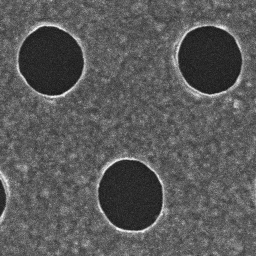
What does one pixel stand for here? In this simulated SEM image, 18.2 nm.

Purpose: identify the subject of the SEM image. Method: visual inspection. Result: holes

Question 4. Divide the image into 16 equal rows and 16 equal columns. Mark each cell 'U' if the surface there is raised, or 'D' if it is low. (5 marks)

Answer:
UUUUUUUUUUUUUUUU
UUUUUUUUUUUUUUUU
UUDDDUUUUUUDDDDU
UDDDDUUUUUUDDDDU
UDDDDUUUUUUDDDDU
UUDDUUUUUUUUDDUU
UUUUUUUUUUUUUUUU
UUUUUUUUUUUUUUUU
UUUUUUUUUUUUUUUU
UUUUUUUUUUUUUUUU
UUUUUUUDDUUUUUUU
UUUUUUDDDDUUUUUU
UUUUUUDDDDUUUUUU
UUUUUUUDDDUUUUUU
UUUUUUUUUUUUUUUU
UUUUUUUUUUUUUUUU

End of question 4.